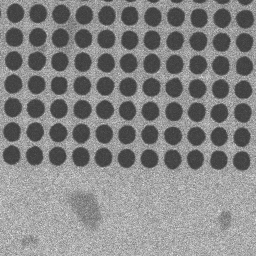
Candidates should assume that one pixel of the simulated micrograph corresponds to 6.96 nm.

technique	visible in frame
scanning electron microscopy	a regular array of holes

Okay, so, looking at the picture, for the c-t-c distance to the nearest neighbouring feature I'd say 22.9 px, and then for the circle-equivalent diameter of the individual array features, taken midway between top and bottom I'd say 127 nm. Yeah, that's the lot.